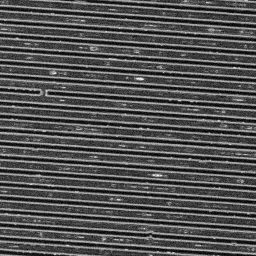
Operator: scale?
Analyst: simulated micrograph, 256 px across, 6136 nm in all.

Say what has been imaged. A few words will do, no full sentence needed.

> parallel lines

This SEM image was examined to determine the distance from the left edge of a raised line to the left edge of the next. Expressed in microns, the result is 0.324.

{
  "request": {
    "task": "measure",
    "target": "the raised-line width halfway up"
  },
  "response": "144 nm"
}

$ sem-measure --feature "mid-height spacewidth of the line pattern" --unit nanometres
191